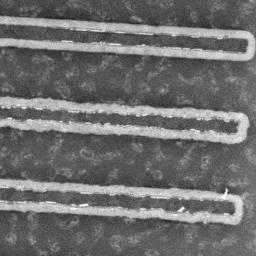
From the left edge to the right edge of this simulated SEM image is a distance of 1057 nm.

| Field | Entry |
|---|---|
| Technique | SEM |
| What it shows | one or a few lines or trenches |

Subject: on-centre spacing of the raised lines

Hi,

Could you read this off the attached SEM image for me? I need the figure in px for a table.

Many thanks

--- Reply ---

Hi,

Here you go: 81.4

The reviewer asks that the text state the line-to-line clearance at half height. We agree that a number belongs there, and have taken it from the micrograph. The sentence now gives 0.245 um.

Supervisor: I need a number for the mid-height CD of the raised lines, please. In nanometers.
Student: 91.7